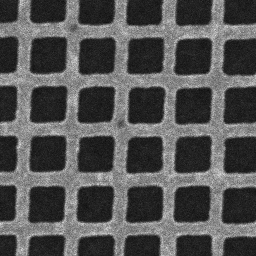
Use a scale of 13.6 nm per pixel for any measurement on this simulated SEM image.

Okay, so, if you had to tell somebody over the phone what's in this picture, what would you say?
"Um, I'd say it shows a regular array of holes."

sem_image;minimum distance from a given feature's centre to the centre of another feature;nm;655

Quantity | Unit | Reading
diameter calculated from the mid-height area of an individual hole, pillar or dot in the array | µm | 0.561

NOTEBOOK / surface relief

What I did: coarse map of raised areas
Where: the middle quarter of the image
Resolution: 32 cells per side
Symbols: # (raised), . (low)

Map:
.##..........##..........###....
###..........##..........##.....
####.......#####........####....
################################
################################
########....##########..########
.###.........####........###....
.###.........###.........###....
.##..........###.........###....
.##..........###.........###....
.##..........###.........###....
.##..........###.........###....
.##..........###.........###....
###.........####.........##.....
####.......#####........####....
################################
################################
################################
####.........####.......#####...
.###.........###.........###....
.###.........###.........###....
.###.........###.........###....
.##..........###.........###....
.##..........##..........###....
.##.........###..........##.....
###.........###..........##.....
###.........####.........###....
#############################..#
################################
################################
#####.......######.#....######..
###..........###.........###....